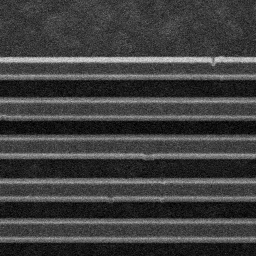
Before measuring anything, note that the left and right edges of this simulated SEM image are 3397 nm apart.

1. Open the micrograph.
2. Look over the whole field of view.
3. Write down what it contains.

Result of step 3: parallel lines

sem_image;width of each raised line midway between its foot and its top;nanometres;252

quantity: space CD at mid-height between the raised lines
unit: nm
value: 289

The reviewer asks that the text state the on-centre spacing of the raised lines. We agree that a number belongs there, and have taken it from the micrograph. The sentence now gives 0.539 µm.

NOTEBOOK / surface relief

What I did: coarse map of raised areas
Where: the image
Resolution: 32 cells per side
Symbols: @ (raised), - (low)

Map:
--------------------------------
--------------------------------
--------------------------------
--------------------------------
--------------------------------
--------------------------------
--------------------------------
---------------------------@----
@@@@@@@@@@@@@@@@@@@@@@@@@@@@@@@@
@@@@@@@@@@@@@@@@@@@@@@@@@@@@@@@@
--------------------------------
--------------------------------
--------------------------------
@@@@@@@@@@@@@@@@@@@@@@@@@@@@@@@@
@@@@@@@@@@@@@@@@@@@@@@@@@@@@@@@@
--------------------------------
--------------------------------
@@@@@@@@@@@@@@@@@@@@@@@@@@@@@@@@
@@@@@@@@@@@@@@@@@@@@@@@@@@@@@@@@
-----------------@@@------------
--------------------------------
--------------------------------
--------------------------------
@@@@@@@@@@@@@@@@@@@@@@@@@@@@@@@@
@@@@@@@@@@@@@@@@@@@@@@@@@@@@@@@@
--------------------------------
--------------------------------
--------------------------------
@@@@@@@@@@@@@@@@@@@@@@@@@@@@@@@@
@@@@@@@@@@@@@@@@@@@@@@@@@@@@@@@@
--------------------------------
--------------------------------